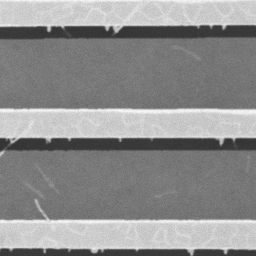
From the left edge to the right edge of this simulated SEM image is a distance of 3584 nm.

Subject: lines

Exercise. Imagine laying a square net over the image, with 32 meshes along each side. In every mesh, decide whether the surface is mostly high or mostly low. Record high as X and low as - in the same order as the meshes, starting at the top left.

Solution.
XXXXXXXXXXXXXXXXXXXXXXXXXXXXXXXX
XXXXXXXXXXXXXXXXXXXXXXXXXXXXXXXX
XXXXXXXXXXXXXXXXXXXXXXXXXXXXXXXX
------X-------X-----------------
--------------------------------
XXXXXXXXXXXXXXXXXXXXXXXXXXXXXXXX
XXXXXXXXXXXXXXXXXXXXXXXXXXXXXXXX
XXXXXXXXXXXXXXXXXXXXXXXXXXXXXXXX
XXXXXXXXXXXXXXXXXXXXXXXXXXXXXXXX
XXXXXXXXXXXXXXXXXXXXXXXXXXXXXXXX
XXXXXXXXXXXXXXXXXXXXXXXXXXXXXXXX
XXXXXXXXXXXXXXXXXXXXXXXXXXXXXXXX
XXXXXXXXXXXXXXXXXXXXXXXXXXXXXXXX
XXXXXXXXXXXXXXXXXXXXXXXXXXXXXXXX
XXXXXXXXXXXXXXXXXXXXXXXXXXXXXXXX
XXXXXXXXXXXXXXXXXXXXXXXXXXXXXXXX
XXXXXXXXXXXXXXXXXXXXXXXXXXXXXXXX
-X-------------------------X----
--------------------------------
XXXXXXXXXXXXXXXXXXXXXXXXXXXXXXXX
XXXXXXXXXXXXXXXXXXXXXXXXXXXXXXXX
XXXXXXXXXXXXXXXXXXXXXXXXXXXXXXXX
XXXXXXXXXXXXXXXXXXXXXXXXXXXXXXXX
XXXXXXXXXXXXXXXXXXXXXXXXXXXXXXXX
XXXXXXXXXXXXXXXXXXXXXXXXXXXXXXXX
XXXXXXXXXXXXXXXXXXXXXXXXXXXXXXXX
XXXXXXXXXXXXXXXXXXXXXXXXXXXXXXXX
XXXXXXXXXXXXXXXXXXXXXXXXXXXXXXXX
XXXXXXXXXXXXXXXXXXXXXXXXXXXXXXXX
XXXXXXXXXXXXXXXXXXXXXXXXXXXXXXXX
XXXXXXXXXXXXXXXXXXXXXXXXXXXXXXXX
--------------------------------